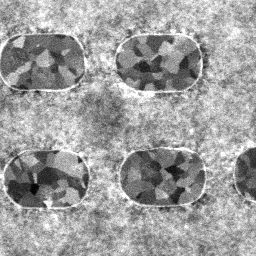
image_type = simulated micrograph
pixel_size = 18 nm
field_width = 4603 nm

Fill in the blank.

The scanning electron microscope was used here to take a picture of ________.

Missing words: raised bodies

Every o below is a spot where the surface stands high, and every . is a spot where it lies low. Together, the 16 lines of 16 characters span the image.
................
................
.oooo...oooo....
ooooo..oooooo...
ooooo..oooooo...
.ooo....oooo....
................
................
................
.ooo....oooo...o
ooooo...ooooo..o
oooooo.oooooo..o
.oooo...oooo....
................
................
................